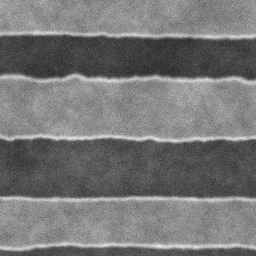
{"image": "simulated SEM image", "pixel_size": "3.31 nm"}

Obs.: lines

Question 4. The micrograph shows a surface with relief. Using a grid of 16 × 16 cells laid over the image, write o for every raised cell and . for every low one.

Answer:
oooooooooooooooo
oooooooooooooooo
................
................
................
oooooooooooooooo
oooooooooooooooo
oooooooooooooooo
oooooooooooooooo
................
................
................
oooooooooooooooo
oooooooooooooooo
oooooooooooooooo
oo..............